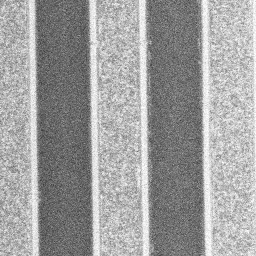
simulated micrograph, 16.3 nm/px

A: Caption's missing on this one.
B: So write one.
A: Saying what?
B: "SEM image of one or a few lines or trenches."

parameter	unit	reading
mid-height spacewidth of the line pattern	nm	997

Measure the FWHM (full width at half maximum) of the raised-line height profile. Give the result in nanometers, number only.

813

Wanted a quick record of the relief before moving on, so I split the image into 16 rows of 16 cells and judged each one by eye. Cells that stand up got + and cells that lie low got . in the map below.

++....+++....+++
++....+++....+++
++....+++....+++
++....+++....+++
++....+++....+++
++....+++....+++
++....+++....+++
++....+++....+++
++....+++....+++
++....+++....+++
++....+++....+++
++....+++....+++
++....+++....+++
++....+++....+++
++....+++....+++
++....+++....+++